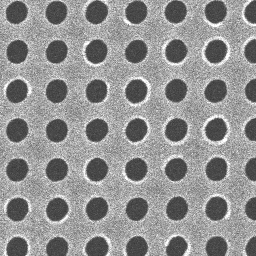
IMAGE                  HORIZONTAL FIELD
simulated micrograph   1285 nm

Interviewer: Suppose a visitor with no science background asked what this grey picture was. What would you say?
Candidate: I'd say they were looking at a regular array of holes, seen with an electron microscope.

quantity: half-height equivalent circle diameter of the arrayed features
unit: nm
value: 115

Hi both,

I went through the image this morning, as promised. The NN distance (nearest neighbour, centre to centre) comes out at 39.2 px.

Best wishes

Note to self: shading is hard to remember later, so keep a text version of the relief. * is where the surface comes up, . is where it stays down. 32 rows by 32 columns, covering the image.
*..***..***..***..***..***..***.
*..***..***..***..***..***..***.
*..***..***..***..***..***..***.
********************************
********************************
*..***..***..***..***..***..***.
*..***..***..***..***..***..***.
*..***..***..***..***..***..***.
********************************
********************************
*..***..***..***..***..***..***.
*..***..***..***..***..***..***.
*..***..***..***..***..***..***.
********************************
********************************
*..***..***..***..***..***..***.
*...**..***..***..***..***..***.
*..***..***..***..***..***..***.
********************************
********************************
*..***..***..***..***..***..***.
*...**..***..***..***..***..***.
*..***..***..***..***..***..***.
********************************
********************************
*..***..***..***..***..***..***.
*..***..***..***..***..***..***.
**.***.*************************
********************************
********************************
*..***..***..***..***..***..***.
*..***..***..***..***..***..***.